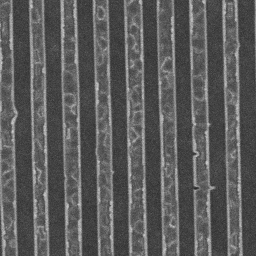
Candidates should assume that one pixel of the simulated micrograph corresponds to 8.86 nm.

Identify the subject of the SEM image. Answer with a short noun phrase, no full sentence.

parallel lines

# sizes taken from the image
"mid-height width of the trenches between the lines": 155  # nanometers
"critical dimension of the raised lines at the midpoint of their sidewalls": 132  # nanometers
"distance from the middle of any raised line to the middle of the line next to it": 285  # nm